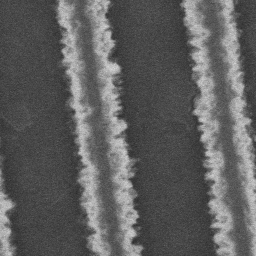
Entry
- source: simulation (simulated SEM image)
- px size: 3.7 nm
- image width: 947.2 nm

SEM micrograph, one or a few lines or trenches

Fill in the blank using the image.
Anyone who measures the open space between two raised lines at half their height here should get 335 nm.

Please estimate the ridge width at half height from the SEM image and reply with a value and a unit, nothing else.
128 nanometers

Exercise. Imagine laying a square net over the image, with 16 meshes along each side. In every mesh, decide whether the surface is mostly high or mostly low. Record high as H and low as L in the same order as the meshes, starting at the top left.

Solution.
LLLLHHLLLLLLHHLL
LLLLHHLLLLLLHHLL
LLLLHHHLLLLLHHLL
LLLLHHHLLLLLHHHL
LLLLLHHLLLLLLHHL
LLLLLHHLLLLLLHHL
LLLLLHHLLLLLLHHL
LLLLLHHLLLLLLHHL
LLLLLHHLLLLLLHHL
LLLLLHHHLLLLLHHL
LLLLLLHHLLLLLHHH
LLLLLLHHLLLLLHHH
LLLLLLHHLLLLLHHH
LLLLLLHHLLLLLLHH
LLLLLLHHLLLLLLHH
LLLLLLHHLLLLLLHH